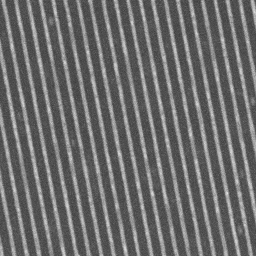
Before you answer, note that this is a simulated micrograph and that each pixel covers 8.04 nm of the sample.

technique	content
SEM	parallel lines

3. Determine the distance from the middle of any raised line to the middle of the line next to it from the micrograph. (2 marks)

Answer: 98.3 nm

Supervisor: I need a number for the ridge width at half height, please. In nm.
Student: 21.7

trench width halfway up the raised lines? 0.0761 um